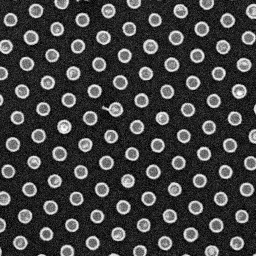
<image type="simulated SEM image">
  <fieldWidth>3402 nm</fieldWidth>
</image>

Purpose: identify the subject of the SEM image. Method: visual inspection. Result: a regular array of raised bodies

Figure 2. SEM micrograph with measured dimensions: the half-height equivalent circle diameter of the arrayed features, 170 nm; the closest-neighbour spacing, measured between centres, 357 nanometers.